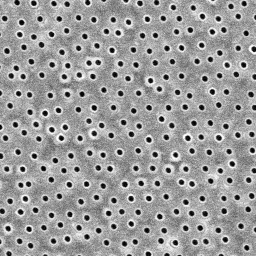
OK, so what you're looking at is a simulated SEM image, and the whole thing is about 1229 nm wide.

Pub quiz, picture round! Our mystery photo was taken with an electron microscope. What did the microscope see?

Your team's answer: a regular array of holes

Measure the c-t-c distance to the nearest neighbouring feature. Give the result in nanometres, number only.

65.3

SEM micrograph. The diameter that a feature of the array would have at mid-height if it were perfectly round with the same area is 29.2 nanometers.